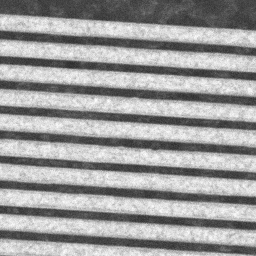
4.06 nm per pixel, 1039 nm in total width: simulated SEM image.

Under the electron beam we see parallel lines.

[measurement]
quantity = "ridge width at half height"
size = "63.8 nm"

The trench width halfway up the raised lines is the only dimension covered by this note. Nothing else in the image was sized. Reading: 39 nm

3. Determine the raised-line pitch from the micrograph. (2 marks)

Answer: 24.9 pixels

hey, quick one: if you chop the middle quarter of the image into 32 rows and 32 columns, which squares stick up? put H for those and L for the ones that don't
LLLLLLLLLLLLLLLLLLLLLLLLLHHHHHHH
HHHHLLLLLLLLLLLLLLLLLLLLLLLLLLLL
HHHHHHHHHHHHHHHHHHHHLLLLLLLLLLLL
HHHHHHHHHHHHHHHHHHHHHHHHHHHHHHHH
HHHHHHHHHHHHHHHHHHHHHHHHHHHHHHHH
LLLLLLLLHHHHHHHHHHHHHHHHHHHHHHHH
LLLLLLLLLLLLLLLLLLLLLLLLHHHHHHHH
LLLLLLLLLLLLLLLLLLLLLLLLLLLLLLLL
HHHHHHHHHHHHHHLLLLLLLLLLLLLLLLLL
HHHHHHHHHHHHHHHHHHHHHHHHHHHHHHLL
HHHHHHHHHHHHHHHHHHHHHHHHHHHHHHHH
LLLLLLHHHHHHHHHHHHHHHHHHHHHHHHHH
LLLLLLLLLLLLLLLLLLLLHHHHHHHHHHHH
LLLLLLLLLLLLLLLLLLLLLLLLLLLLLLLL
HHHHHHHHHHHHLLLLLLLLLLLLLLLLLLLL
HHHHHHHHHHHHHHHHHHHHHHHHHHHHLLLL
HHHHHHHHHHHHHHHHHHHHHHHHHHHHHHHH
LHHHHHHHHHHHHHHHHHHHHHHHHHHHHHHH
LLLLLLLLLLLLLLLLHHHHHHHHHHHHHHHH
LLLLLLLLLLLLLLLLLLLLLLLLLLLLLLLL
HHHHHHHLLLLLLLLLLLLLLLLLLLLLLLLL
HHHHHHHHHHHHHHHHHHHHHHLLLLLLLLLL
HHHHHHHHHHHHHHHHHHHHHHHHHHHHHHHH
HHHHHHHHHHHHHHHHHHHHHHHHHHHHHHHH
LLLLLLLLLLLHHHHHHHHHHHHHHHHHHHHH
LLLLLLLLLLLLLLLLLLLLLLLLLLHHHHHH
HHHHHLLLLLLLLLLLLLLLLLLLLLLLLLLL
HHHHHHHHHHHHHHHHHHHHLLLLLLLLLLLL
HHHHHHHHHHHHHHHHHHHHHHHHHHHHHHHH
HHHHHHHHHHHHHHHHHHHHHHHHHHHHHHHH
LLLLLLLLLHHHHHHHHHHHHHHHHHHHHHHH
LLLLLLLLLLLLLLLLLLLLLLLLHHHHHHHH